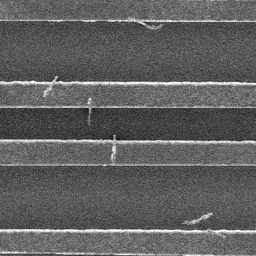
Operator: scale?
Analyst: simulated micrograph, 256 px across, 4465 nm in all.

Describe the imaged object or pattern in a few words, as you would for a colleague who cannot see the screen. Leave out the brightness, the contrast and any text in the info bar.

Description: lines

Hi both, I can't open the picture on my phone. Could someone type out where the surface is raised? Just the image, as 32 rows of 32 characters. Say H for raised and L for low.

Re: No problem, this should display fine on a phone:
HHHHHHHHHHHHHHHHHHHHHHHHHHHHHHHH
HHHHHHHHHHHHHHHHHHHHHHHHHHHHHHHH
HHHHHHHHHHHHHHHHHHHHHHHHHHHHHHHH
LLLLLLLLLLLLLLLLLLLLLLLLLLLLLLLL
LLLLLLLLLLLLLLLLLLLLLLLLLLLLLLLL
LLLLLLLLLLLLLLLLLLLLLLLLLLLLLLLL
LLLLLLLLLLLLLLLLLLLLLLLLLLLLLLLL
LLLLLLLLLLLLLLLLLLLLLLLLLLLLLLLL
LLLLLLLLLLLLLLLLLLLLLLLLLLLLLLLL
LLLLLLLLLLLLLLLLLLLLLLLLLLLLLLLL
HHHHHHHHHHHHHHHHHHHHHHHHHHHHHHHH
HHHHHHHHHHHHHHHHHHHHHHHHHHHHHHHH
HHHHHHHHHHHHHHHHHHHHHHHHHHHHHHHH
LLLLLLLLLLLHLLLLLLLLLLLLLLLLLLLL
LLLLLLLLLLLLLLLLLLLLLLLLLLLLLLLL
LLLLLLLLLLLLLLLLLLLLLLLLLLLLLLLL
LLLLLLLLLLLLLLLLLLLLLLLLLLLLLLLL
LLLLLLLLLLLLLLLLLLLLLLLLLLLLLLLL
HHHHHHHHHHHHHHHHHHHHHHHHHHHHHHHH
HHHHHHHHHHHHHHHHHHHHHHHHHHHHHHHH
HHHHHHHHHHHHHHHHHHHHHHHHHHHHHHHH
LLLLLLLLLLLLLLLLLLLLLLLLLLLLLLLL
LLLLLLLLLLLLLLLLLLLLLLLLLLLLLLLL
LLLLLLLLLLLLLLLLLLLLLLLLLLLLLLLL
LLLLLLLLLLLLLLLLLLLLLLLLLLLLLLLL
LLLLLLLLLLLLLLLLLLLLLLLLLLLLLLLL
LLLLLLLLLLLLLLLLLLLLLLLLLLLLLLLL
LLLLLLLLLLLLLLLLLLLLLLLLLLLLLLLL
LLLLLLLLLLLLLLLLLLLLLLLLLLLLLLLL
HHHHHHHHHHHHHHHHHHHHHHHHHHHHHHHH
HHHHHHHHHHHHHHHHHHHHHHHHHHHHHHHH
HHHHHHHHHHHHHHHHHHHHHHHHHHHHHHHH